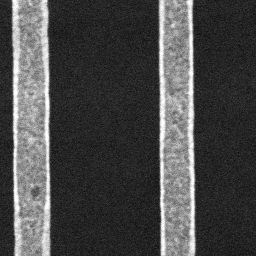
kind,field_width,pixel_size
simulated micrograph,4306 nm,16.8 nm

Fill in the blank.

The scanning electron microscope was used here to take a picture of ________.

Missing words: wiring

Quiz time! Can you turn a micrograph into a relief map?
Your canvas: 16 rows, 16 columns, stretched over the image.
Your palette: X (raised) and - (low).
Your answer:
-XX-------XX----
-XX-------XX----
-XX-------XX----
-XX-------XX----
-XX-------XX----
-XX-------XX----
-XX-------XX----
-XX-------XX----
-XX-------XX----
-XX-------XX----
-XX-------XX----
-XX-------XX----
-XX-------XX----
-XX-------XX----
-XX-------XX----
-XX-------XX----